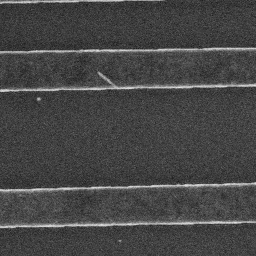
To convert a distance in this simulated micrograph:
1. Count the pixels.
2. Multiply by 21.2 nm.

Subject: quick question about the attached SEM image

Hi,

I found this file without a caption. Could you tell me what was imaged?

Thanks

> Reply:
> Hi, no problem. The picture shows lines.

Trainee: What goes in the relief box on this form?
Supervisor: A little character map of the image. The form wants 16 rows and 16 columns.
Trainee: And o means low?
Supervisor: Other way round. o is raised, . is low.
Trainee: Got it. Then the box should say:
................
................
................
oooooooooooooooo
oooooooooooooooo
oooooooo........
................
................
................
................
................
..............oo
oooooooooooooooo
oooooooooooooooo
................
................